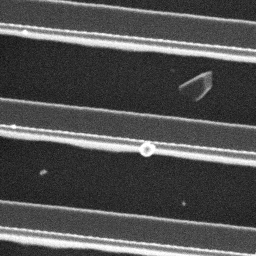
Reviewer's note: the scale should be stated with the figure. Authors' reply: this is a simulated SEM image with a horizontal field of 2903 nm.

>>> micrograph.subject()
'lines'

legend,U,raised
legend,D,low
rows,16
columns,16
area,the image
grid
UUUUUUUUDDDDDDDD
UUUUUUUUUUUUUUUU
DDDDDUUUUUUUUUUU
DDDDDDDDDDDDDDUU
DDDDDDDDDDDDDDDD
DDDDDDDDDDDDDDDD
UUUDDDDDDDDDDDDD
UUUUUUUUUUUUDDDD
DDUUUUUUUUUUUUUU
DDDDDDDDDUUUUUUU
DDDDDDDDDDDDDDDD
DDDDDDDDDDDDDDDD
DDDDDDDDDDDDDDDD
UUUUUUUUUDDDDDDD
UUUUUUUUUUUUUUUU
DDDDDDDUUUUUUUUU